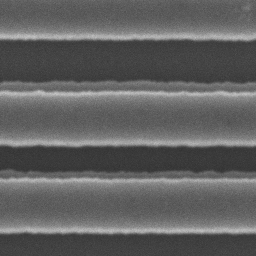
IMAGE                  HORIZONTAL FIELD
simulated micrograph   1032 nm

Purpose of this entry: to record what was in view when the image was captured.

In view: lines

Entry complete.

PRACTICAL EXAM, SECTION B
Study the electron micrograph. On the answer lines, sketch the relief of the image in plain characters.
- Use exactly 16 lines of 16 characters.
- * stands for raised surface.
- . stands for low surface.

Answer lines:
****************
****************
................
................
................
****************
****************
****************
****************
................
................
****************
****************
****************
****************
................